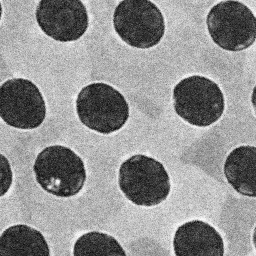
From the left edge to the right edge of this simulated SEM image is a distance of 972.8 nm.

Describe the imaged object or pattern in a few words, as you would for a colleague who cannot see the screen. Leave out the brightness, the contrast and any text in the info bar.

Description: holes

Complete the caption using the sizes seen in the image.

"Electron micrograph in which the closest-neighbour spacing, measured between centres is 0.306 micrometres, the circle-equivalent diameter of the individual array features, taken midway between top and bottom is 0.197 microns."